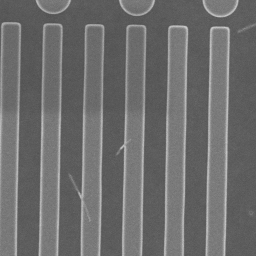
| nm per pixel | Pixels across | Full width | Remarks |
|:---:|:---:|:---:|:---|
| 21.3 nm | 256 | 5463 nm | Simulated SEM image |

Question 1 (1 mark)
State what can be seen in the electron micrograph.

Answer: groups of lines, slits or small figures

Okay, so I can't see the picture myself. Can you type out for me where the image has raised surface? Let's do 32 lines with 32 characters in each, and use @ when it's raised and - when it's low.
-----@@@@------@@@@------@@@@@--
------@@--------@@--------@@@---
--------------------------------
@@----@@---@@---@@---@@----@----
@@---@@@---@@---@@---@@---@@@---
@@---@@@---@@---@@---@@---@@@---
@@---@@@---@@---@@---@@---@@@---
@@---@@@---@@---@@---@@---@@@---
@@---@@@---@@---@@---@@---@@----
@@---@@@---@@---@@---@@---@@----
@@---@@@---@@---@@---@@---@@----
@@---@@@---@@---@@---@@---@@----
@@---@@@---@@---@@---@@---@@----
@@---@@@--@@@---@@---@@---@@----
@@---@@@--@@@---@@---@@---@@----
@@---@@@--@@@---@@---@@---@@----
@@---@@---@@@---@@---@@---@@----
@@---@@---@@@---@@---@@---@@----
@@---@@---@@@--@@@---@@---@@----
@@---@@---@@@---@@---@@---@@----
@@---@@---@@@---@@---@@---@@----
@@---@@---@@@---@@---@@---@@----
@@---@@---@@@---@@---@@---@@----
@@---@@---@@@---@@---@@---@@----
@@---@@---@@@---@@---@@---@@----
@@---@@---@@@---@@---@@---@@----
@@---@@---@@@--@@@---@@---@@----
@@---@@---@@---@@@---@@---@@----
@@---@@---@@---@@@---@@---@@----
@@---@@---@@---@@@---@@---@@----
@@---@@---@@---@@@---@@---@@----
@@---@@---@@---@@@---@@---@@----